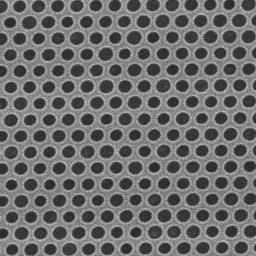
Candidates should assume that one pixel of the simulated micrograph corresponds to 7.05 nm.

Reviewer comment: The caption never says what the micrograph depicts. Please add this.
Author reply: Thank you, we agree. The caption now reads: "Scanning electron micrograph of a regular array of holes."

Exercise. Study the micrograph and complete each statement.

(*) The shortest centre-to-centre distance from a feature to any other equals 0.131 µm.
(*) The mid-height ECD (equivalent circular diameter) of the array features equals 91.7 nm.